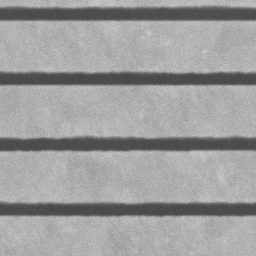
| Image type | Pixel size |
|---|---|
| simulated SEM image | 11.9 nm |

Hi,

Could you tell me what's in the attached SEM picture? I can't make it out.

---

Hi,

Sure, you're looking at lines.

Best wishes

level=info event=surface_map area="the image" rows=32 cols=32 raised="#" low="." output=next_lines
################################
................................
................................
################################
################################
################################
################################
################################
################################
................................
................................
################################
################################
################################
################################
################################
################################
................................
................................
################################
################################
################################
################################
################################
################################
................................
................................
################################
################################
################################
################################
################################